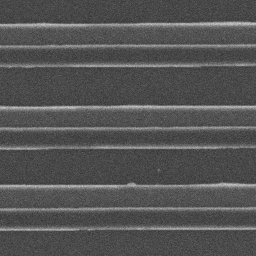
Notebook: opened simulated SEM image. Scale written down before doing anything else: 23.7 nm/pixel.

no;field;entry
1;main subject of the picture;lines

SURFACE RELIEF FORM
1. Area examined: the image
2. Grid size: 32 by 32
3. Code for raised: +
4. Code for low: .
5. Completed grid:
................................
................................
................................
++++++++++++++++++++++++++++++++
++++++++++++++++++++++++++++++++
++++++++++++++++++++++++++++++++
++++++++++++++++++++++++++++++++
++++++++++++++++++++++++++++++++
................................
................................
................................
................................
................................
......++++++++++++++++++++++++++
++++++++++++++++++++++++++++++++
++++++++++++++++++++++++++++++++
++++++++++++++++++++++++++++++++
++++++++++++++++++++++++++++++++
++++++++++++++++++++............
................................
................................
................................
................................
++++++++++++++++++++++++++++++++
++++++++++++++++++++++++++++++++
++++++++++++++++++++++++++++++++
++++++++++++++++++++++++++++++++
++++++++++++++++++++++++++++++++
++++++++++++++++++++++++++++++++
................................
................................
................................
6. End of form